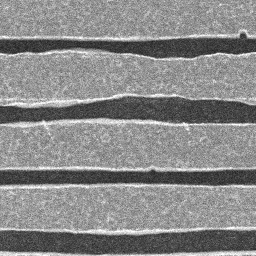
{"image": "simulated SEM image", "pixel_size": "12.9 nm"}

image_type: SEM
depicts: one or a few lines or trenches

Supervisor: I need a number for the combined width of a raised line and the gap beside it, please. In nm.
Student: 845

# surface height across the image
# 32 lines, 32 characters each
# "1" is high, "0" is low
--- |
11111111111111111111111111111111
11111111111111111111111111111111
11111111111111111111111111111111
11111111111111111111111111111111
11111111111111111111111111111101
00000000000000000000000000000000
00000011110000000000000000000000
11111111111111111111111111111111
11111111111111111111111111111111
11111111111111111111111111111111
11111111111111111111111111111111
11111111111111111111111111111111
11111111111100000000000000001111
00000000000000000000000000000000
00000000000000000000000000000000
00000111111111111111100111000010
11111111111111111111111111111111
11111111111111111111111111111111
11111111111111111111111111111111
11111111111111111111111111111111
11111111111111111111111111111111
00000000000000000000000000000000
00000000000000000000000000000000
11111111111111111111111111111111
11111111111111111111111111111111
11111111111111111111111111111111
11111111111111111111111111111111
11111111111111111111111111111111
11111111111111111111111111111110
00000000000000000000000000000000
00000000000000000000000000000000
00000000000000000000000000000000